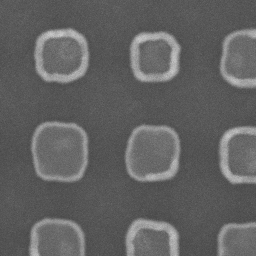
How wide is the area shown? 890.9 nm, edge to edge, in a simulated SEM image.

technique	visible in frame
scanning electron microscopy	raised bodies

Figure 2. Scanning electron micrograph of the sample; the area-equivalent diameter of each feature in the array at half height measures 191 nm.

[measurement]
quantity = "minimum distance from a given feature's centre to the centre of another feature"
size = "324 nm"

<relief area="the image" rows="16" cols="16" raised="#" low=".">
................
................
..###...###...##
..###...###...##
..###...###...##
................
................
................
..###...###...##
..###...###...##
..###...###...##
................
................
................
..###...###...##
..###...###...##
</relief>